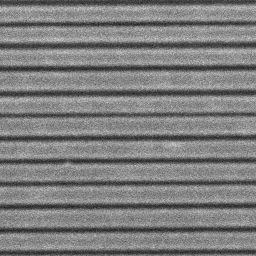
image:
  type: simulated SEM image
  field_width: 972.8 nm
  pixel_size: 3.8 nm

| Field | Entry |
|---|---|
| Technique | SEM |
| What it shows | parallel lines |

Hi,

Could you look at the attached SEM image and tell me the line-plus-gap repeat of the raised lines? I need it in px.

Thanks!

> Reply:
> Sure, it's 22.7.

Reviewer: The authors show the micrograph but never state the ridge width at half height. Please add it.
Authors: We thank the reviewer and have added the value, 61.7 nm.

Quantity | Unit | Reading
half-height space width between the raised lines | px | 6